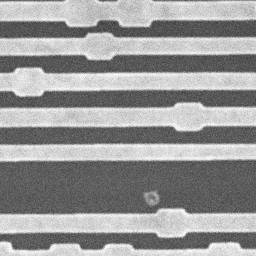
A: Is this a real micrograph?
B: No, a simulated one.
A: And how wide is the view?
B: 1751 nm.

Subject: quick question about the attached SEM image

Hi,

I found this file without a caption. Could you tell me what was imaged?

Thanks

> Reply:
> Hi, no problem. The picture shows wiring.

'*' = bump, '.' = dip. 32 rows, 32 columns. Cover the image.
********************************
********************************
*************.******............
................................
...........***..................
********************************
********************************
................................
................................
********************************
********************************
..***...........................
................................
.....................*****......
********************************
********************************
................................
................................
********************************
********************************
................................
................................
................................
................................
................................
................................
....................***.........
********************************
********************************
....................**..........
*...........................*...
********************************